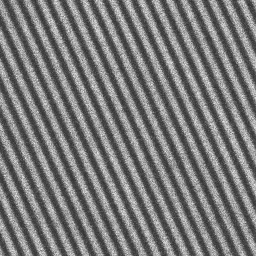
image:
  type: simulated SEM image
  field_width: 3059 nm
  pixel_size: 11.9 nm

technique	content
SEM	parallel lines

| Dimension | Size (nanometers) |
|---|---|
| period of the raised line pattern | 155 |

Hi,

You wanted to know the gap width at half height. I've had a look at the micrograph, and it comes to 80.2 nm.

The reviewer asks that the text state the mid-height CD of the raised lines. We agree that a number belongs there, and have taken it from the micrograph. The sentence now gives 0.0802 µm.